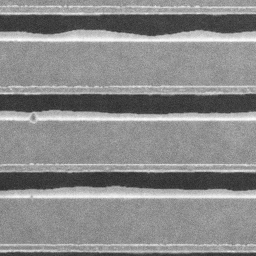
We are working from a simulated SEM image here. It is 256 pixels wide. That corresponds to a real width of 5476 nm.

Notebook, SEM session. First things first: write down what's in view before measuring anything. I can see lines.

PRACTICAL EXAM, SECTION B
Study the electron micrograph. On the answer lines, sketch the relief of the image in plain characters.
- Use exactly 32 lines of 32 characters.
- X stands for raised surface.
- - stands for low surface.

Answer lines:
XXXXXXXXXXXXXXXXXXXXXXXXXXXXXXXX
XXXXXXXXXXXXXXXXXXXXXXXXXXXXXXXX
--------------------------------
--------------------------------
--------------------------------
XXXXXXXXXXXXXXXXXXXXXXXXXXXXXXXX
XXXXXXXXXXXXXXXXXXXXXXXXXXXXXXXX
XXXXXXXXXXXXXXXXXXXXXXXXXXXXXXXX
XXXXXXXXXXXXXXXXXXXXXXXXXXXXXXXX
XXXXXXXXXXXXXXXXXXXXXXXXXXXXXXXX
XXXXXXXXXXXXXXXXXXXXXXXXXXXXXXXX
XXXXXXXXXXXXXXXXXXXXXXXXXXXXXXXX
--------------------------------
--------------------------------
---XX-X-------------------------
XXXXXXXXXXXXXXXXXXXXXXXXXXXXXXXX
XXXXXXXXXXXXXXXXXXXXXXXXXXXXXXXX
XXXXXXXXXXXXXXXXXXXXXXXXXXXXXXXX
XXXXXXXXXXXXXXXXXXXXXXXXXXXXXXXX
XXXXXXXXXXXXXXXXXXXXXXXXXXXXXXXX
XXXXXXXXXXXXXXXXXXXXXXXXXXXXXXXX
--------------------------------
--------------------------------
--------------------------------
XXXXXXXXXXXXXXXXXXXXXXXXXXXXXXXX
XXXXXXXXXXXXXXXXXXXXXXXXXXXXXXXX
XXXXXXXXXXXXXXXXXXXXXXXXXXXXXXXX
XXXXXXXXXXXXXXXXXXXXXXXXXXXXXXXX
XXXXXXXXXXXXXXXXXXXXXXXXXXXXXXXX
XXXXXXXXXXXXXXXXXXXXXXXXXXXXXXXX
XXXXXXXXXXXXXXXXXXXXXXXXXXXXXXXX
--------------------------------